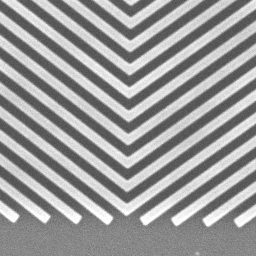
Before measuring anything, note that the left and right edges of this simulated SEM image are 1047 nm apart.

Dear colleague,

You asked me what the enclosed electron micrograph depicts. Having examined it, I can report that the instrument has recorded groups of lines, slits or small figures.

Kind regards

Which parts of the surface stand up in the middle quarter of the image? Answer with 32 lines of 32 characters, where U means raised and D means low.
UUDDDDUUUDDDDUUUUUUUDDDDUUUUDDDD
UUUDDDDUUUDDDDDUUUDDDDDUUUDDDDDU
DUUUDDDDUUUUDDDDUDDDDUUUUDDDDUUU
DDUUUDDDDDUUUDDDDDDDUUUDDDDDUUUU
DDDUUUUDDDDUUUDDDDDUUUDDDDDUUUDD
DDDDDUUUDDDDUUUUDUUUUDDDDUUUUDDD
UUDDDDUUUDDDDDUUUUUDDDDDUUUDDDDD
UUUDDDDUUUDDDDDUUUDDDDUUUUDDDDUU
DUUUDDDDUUUUDDDDDDDDDUUUUDDDDUUU
DDUUUDDDDDUUUDDDDDDUUUUDDDDDUUUD
DDDUUUUDDDDUUUDDDDUUUUDDDDUUUUDD
DDDDDUUUDDDDUUUUDUUUDDDDDUUUDDDD
UUDDDDUUUDDDDDUUUUUDDDDUUUUDDDDU
UUUDDDDUUUDDDDDUUUDDDDUUUUDDDDUU
DUUUDDDDDUUUDDDDDDDDDUUUDDDDDUUU
DDUUUUDDDDUUUDDDDDDUUUUDDDDUUUUD
DDDUUUUDDDDUUUDDDDUUUDDDDDUUUDDD
UDDDDUUUDDDDUUUUUUUUDDDDUUUUDDDD
UUDDDDUUUDDDDDUUUUDDDDDUUUUDDDDU
UUUDDDDUUUUDDDDUUDDDDDUUUDDDDDUU
DUUUDDDDDUUUDDDDDDDDUUUUDDDDUUUU
DDUUUUDDDDUUUDDDDDDUUUDDDDDUUUDD
DDDDUUUDDDDUUUUDDDUUUDDDDDUUUDDD
UDDDDUUUDDDDDUUUUUUUDDDDUUUUDDDD
UUDDDDUUUUDDDDUUUUDDDDDUUUDDDDDU
UUUDDDDUUUUDDDDUUDDDDUUUUDDDDUUU
DUUUUDDDDUUUDDDDDDDDUUUDDDDDUUUD
DDUUUUDDDDUUUDDDDDDUUUDDDDDUUUDD
DDDDUUUDDDDUUUUDDUUUUDDDDUUUUDDD
UDDDDUUUDDDDDUUUUUUDDDDDUUUDDDDD
UUDDDDUUUUDDDDUUUUDDDDUUUUDDDDUU
UUUDDDDDUUUDDDDUDDDDDUUUUDDDDUUU